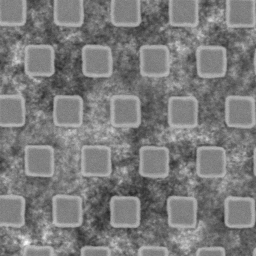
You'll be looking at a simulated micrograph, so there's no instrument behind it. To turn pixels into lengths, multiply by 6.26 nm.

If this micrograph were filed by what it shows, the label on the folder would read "a regular array of raised bodies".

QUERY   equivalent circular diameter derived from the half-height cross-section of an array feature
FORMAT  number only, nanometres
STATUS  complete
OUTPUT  200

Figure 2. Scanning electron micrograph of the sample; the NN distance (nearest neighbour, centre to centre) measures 358 nanometres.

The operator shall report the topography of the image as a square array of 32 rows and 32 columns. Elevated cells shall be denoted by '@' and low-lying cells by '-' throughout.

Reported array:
@@@----@@@----@@@----@@@@---@@@@
@@@----@@@----@@@----@@@@---@@@@
@@@----@@@----@@@----@@@@---@@@@
--------------------------------
--------------------------------
--------------------------------
---@@@@---@@@@----@@@----@@@----
---@@@@---@@@@----@@@----@@@----
---@@@@---@@@@----@@@----@@@----
------------@-------------@@----
--------------------------------
--------------------------------
@@@----@@@----@@@----@@@----@@@-
@@@----@@@----@@@----@@@@---@@@@
@@@----@@@----@@@----@@@@---@@@@
@@@----@@@----@@@----@@@-----@@@
--------------------------------
--------------------------------
---@@@-----@@-----@@-----@@@----
---@@@@---@@@@----@@@----@@@----
---@@@@---@@@@----@@@----@@@----
---@@@@---@@@@----@@@----@@@----
--------------------------------
--------------------------------
--------------------------------
@@@----@@@----@@@----@@@----@@@@
@@@----@@@----@@@----@@@----@@@@
@@@----@@@----@@@----@@@----@@@@
--------------------------------
--------------------------------
--------------------------------
---@@@----@@@@----@@@----@@@----